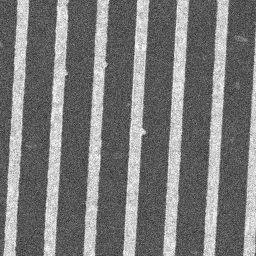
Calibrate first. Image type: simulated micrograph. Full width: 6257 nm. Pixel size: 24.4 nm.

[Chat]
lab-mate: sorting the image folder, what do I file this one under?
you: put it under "parallel lines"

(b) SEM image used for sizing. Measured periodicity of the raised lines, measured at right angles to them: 974 nanometres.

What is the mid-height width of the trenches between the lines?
720 nm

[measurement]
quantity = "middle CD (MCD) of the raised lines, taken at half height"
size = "253 nm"